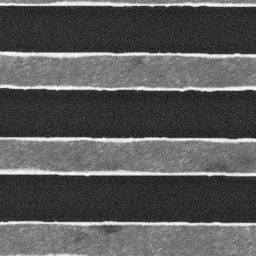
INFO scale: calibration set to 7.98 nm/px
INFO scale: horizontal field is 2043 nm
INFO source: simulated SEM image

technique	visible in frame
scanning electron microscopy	lines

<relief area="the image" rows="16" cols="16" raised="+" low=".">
................
................
................
++++++++++++++++
++++++++++++++++
.+++++++++++++++
................
................
................
++++++++++++++++
++++++++++++++++
................
................
................
++++++++++++++++
++++++++++++++++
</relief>